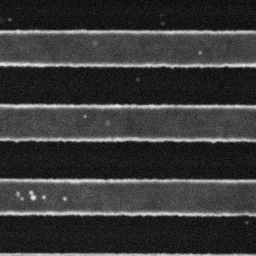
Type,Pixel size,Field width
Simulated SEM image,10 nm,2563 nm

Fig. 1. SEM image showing lines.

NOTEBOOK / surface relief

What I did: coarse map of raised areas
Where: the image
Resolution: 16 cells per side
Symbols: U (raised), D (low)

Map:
DDDDDDDDDDDDDDDD
DDDDDDDDDDDDDDDD
UUUUUUUUUUUUUUUU
UUUUUUUUUUUUUUUU
DDDDDDDDDDDDDDDD
DDDDDDDDDDDDDDDD
DDDDDDDDDDDDDDDD
UUUUUUUUUUUUUUUU
UUUUUUUUUUUUUUUU
DDDDDDDDDDDDDDDD
DDDDDDDDDDDDDDDD
UUUUUUUUUUUUUUUU
UUUUUUUUUUUUUUUU
DDDDDDDDDDDDDDDD
DDDDDDDDDDDDDDDD
DDDDDDDDDDDDDDDD